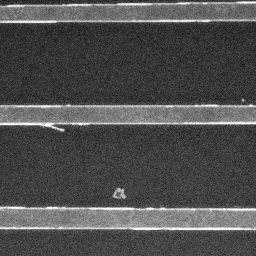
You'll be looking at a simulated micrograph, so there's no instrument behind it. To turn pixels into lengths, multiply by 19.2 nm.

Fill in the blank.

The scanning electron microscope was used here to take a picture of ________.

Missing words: lines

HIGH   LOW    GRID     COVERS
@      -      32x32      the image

----------------------@@@@@@@@@@
@@@@@@@@@@@@@@@@@@@@@@@@@@@@@@@@
@@@@@@@@@@@@@@@@@@@@@@@@@@@@@@@@
--------------------------------
--------------------------------
--------------------------------
--------------------------------
--------------------------------
--------------------------------
--------------------------------
--------------------------------
--------------------------------
--------------------------------
@@@@@@@@@@@@@@@@@@@@@@@@@@@@@@@@
@@@@@@@@@@@@@@@@@@@@@@@@@@@@@@@@
@@@@@@@--@@---------------------
--------------------------------
--------------------------------
--------------------------------
--------------------------------
--------------------------------
--------------------------------
--------------------------------
--------------------------------
--------------------------------
--------------------------------
@@@@@@@@@@@@@@@@@@@@@@@@@@@@@@@@
@@@@@@@@@@@@@@@@@@@@@@@@@@@@@@@@
@@@@@@@@@@@@@@@@@@@@@@@@@@@@@@@@
--------------------------------
--------------------------------
--------------------------------